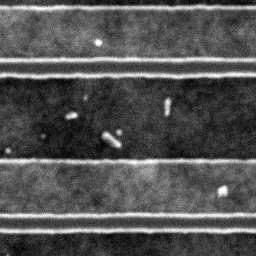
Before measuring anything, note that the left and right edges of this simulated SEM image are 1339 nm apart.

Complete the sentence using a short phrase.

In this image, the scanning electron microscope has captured lines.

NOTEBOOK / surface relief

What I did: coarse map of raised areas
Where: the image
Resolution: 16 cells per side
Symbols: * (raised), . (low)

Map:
****************
****************
****************
****************
****************
................
................
................
................
................
****************
****************
****************
****************
****..*......*..
................